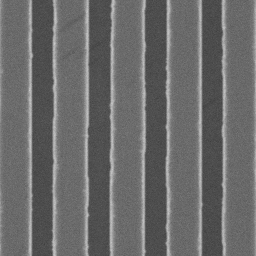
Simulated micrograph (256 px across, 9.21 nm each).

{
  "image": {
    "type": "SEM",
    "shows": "lines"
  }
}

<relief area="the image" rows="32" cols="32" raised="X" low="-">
XXXX---XXXX---XXXX---XXXX---XXXX
XXXX---XXXX---XXXX---XXXX---XXXX
XXXX---XXXX---XXXX---XXXX---XXXX
XXXX---XXXX---XXXX---XXXX---XXXX
XXXX---XXXX---XXXX---XXXX---XXXX
XXXX---XXXX---XXXX---XXXX---XXXX
XXXX---XXXX---XXXX---XXXX---XXXX
XXXX---XXXX---XXXX---XXXX---XXXX
XXXX---XXXX---XXXX---XXXX---XXXX
XXXX---XXXX---XXXX---XXXX---XXXX
XXXX---XXXX---XXXX---XXXX---XXXX
XXXX---XXXX---XXXX---XXXX---XXXX
XXXX---XXXX---XXXX---XXXX---XXXX
XXXX---XXXX---XXXX---XXXX---XXXX
XXXX---XXXX---XXXX---XXXX---XXXX
XXXX---XXXX---XXXX---XXXX---XXXX
XXXX---XXXX---XXXX---XXXX---XXXX
XXXX---XXXX---XXXX---XXXX---XXXX
XXXX---XXXX---XXXX---XXXX---XXXX
XXXX---XXXX---XXXX---XXXX---XXXX
XXXX---XXXX---XXXX---XXXX---XXXX
XXXX---XXXX---XXXX---XXXX---XXXX
XXXX---XXXX---XXXX---XXXX---XXXX
XXXX---XXXX---XXXX---XXXX---XXXX
XXXX---XXXX---XXXX---XXXX---XXXX
XXXX---XXXX---XXXX---XXXX---XXXX
XXXX---XXXX---XXXX---XXXX---XXXX
XXXX---XXXX---XXXX---XXXX---XXXX
XXXX---XXXX---XXXX---XXXX---XXXX
XXXX---XXXX---XXXX---XXXX---XXXX
XXXX---XXXX---XXXX---XXXX---XXXX
XXXX---XXXX---XXXX---XXXX---XXXX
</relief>